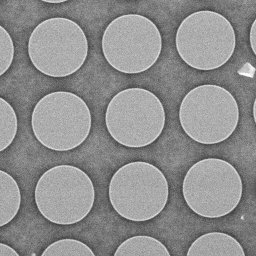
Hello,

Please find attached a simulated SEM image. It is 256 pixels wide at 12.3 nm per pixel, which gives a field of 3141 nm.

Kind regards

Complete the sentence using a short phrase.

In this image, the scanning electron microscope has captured an array of small figures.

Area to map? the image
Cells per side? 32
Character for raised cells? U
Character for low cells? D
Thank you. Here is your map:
DDDDDDDDDDDDDDDDDDDDDDDDDDDDDDDD
DDDDDDDDDDDDDDDDDDDDDDDDDUUDDDDD
DDDDDDUUUDDDDDUUUUUDDDDUUUUUDDDD
DDDDUUUUUUDDDUUUUUUUDDUUUUUUUDDU
UDDDUUUUUUUDDUUUUUUUDDUUUUUUUDDU
UUDDUUUUUUUDDUUUUUUUDDUUUUUUUDDU
UUDDUUUUUUUDDUUUUUUUDDUUUUUUUDDD
UDDDUUUUUUUDDUUUUUUDDDDUUUUUDDDD
UDDDDUUUUUDDDDUUUUUDDDDDDUUDDDDU
DDDDDDDUDDDDDDDDDDDDDDDDDDDDDDDD
DDDDDDDDDDDDDDDDDDDDDDDDDDDDDDDD
DDDDDDDDDDDDDDDUUUUDDDDDUUUUUDDD
DDDDDUUUUUDDDDUUUUUUDDDUUUUUUDDD
UDDDUUUUUUUDDUUUUUUUDDDUUUUUUUDD
UUDDUUUUUUUDDUUUUUUUUDDUUUUUUUDD
UUDDUUUUUUUDDUUUUUUUDDDUUUUUUUDD
UUDDUUUUUUUDDDUUUUUUDDDUUUUUUDDD
UUDDDUUUUUDDDDDUUUUDDDDDUUUUDDDD
UDDDDDUUUDDDDDDDDDDDDDDDDDDDDDDD
DDDDDDDDDDDDDDDDDDDDDDDDDDDDDDDD
DDDDDDDDDDDDDDDDUUUDDDDDDUUUUDDD
DDDDDDUUUUDDDDDUUUUUDDDDUUUUUUDD
UUDDDUUUUUUDDDUUUUUUUDDUUUUUUUDD
UUDDDUUUUUUUDDUUUUUUUDDUUUUUUUDD
UUDDUUUUUUUUDDUUUUUUUDDUUUUUUUDD
UUDDDUUUUUUUDDUUUUUUUDDDUUUUUUDD
UUDDDUUUUUUDDDDUUUUUDDDDDUUUUDDD
UDDDDDUUUUDDDDDDDUDDDDDDDDDDDDDD
DDDDDDDDDDDDDDDDDDDDDDDDDDDDDDDD
DDDDDDDDDDDDDDDDDDDDDDDDDUUUUDDD
DDDDDDDUUUDDDDDUUUUUDDDDUUUUUUDD
UUDDDDUUUUUDDDUUUUUUUDDDUUUUUUDD